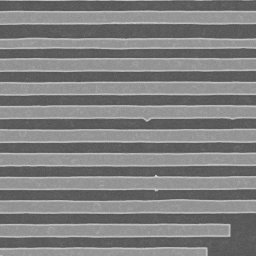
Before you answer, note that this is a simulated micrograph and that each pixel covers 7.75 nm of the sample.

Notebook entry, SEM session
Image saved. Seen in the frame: parallel lines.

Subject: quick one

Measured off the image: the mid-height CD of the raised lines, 91.1 nm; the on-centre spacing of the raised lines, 183 nm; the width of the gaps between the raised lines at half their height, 0.0911 um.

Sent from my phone